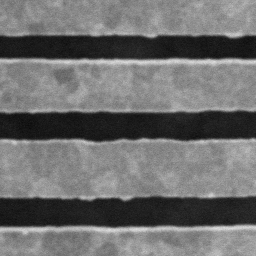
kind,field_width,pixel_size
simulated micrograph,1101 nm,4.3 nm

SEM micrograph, lines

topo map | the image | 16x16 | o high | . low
oooooooooooooooo
oooooooooooooooo
................
................
oooooooooooooooo
oooooooooooooooo
oooooooooooooooo
................
................
oooooooooooooooo
oooooooooooooooo
oooooooooooooooo
................
................
oooooooooooooooo
oooooooooooooooo